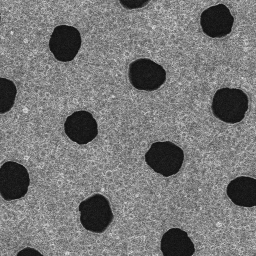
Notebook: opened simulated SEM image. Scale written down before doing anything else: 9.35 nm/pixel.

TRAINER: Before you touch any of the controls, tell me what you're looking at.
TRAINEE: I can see holes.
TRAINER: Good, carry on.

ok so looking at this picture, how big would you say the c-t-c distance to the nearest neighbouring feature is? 786 nm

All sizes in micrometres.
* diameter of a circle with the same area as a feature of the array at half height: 0.322